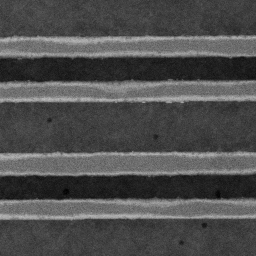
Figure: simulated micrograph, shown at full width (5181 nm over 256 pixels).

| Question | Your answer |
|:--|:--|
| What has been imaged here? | lines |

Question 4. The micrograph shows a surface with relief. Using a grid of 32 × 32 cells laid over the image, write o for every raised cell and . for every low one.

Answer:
................................
................................
................................
................................
................................
oooooooooooooooooooooooooooooooo
oooooooooooooooooooooooooooooooo
................................
................................
................................
oooooooooooooooooooooooooooooooo
oooooooooooooooooooooooooooooooo
ooooooooooooooooooooooooooooooo.
................................
................................
................................
................................
................................
................................
oooooooooooooooooooooooooooooooo
oooooooooooooooooooooooooooooooo
oooooooooooooooooooooooooooooooo
................................
................................
................................
oooooooooooooooooooooooooooooooo
oooooooooooooooooooooooooooooooo
................................
................................
................................
................................
................................